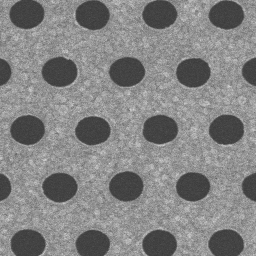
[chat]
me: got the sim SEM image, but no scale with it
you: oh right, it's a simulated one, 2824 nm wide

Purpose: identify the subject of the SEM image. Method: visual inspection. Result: a regular array of holes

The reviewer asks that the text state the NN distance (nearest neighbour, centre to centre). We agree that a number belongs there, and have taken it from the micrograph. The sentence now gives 728 nanometers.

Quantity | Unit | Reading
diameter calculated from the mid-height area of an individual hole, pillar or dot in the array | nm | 357